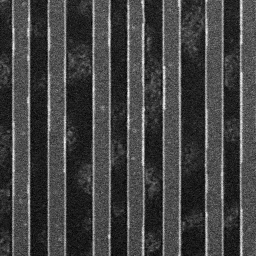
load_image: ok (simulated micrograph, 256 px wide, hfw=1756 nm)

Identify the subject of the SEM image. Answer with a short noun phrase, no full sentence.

parallel lines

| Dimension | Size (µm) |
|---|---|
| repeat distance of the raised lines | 0.265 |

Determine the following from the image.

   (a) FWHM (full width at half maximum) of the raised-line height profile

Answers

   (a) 112 nanometres